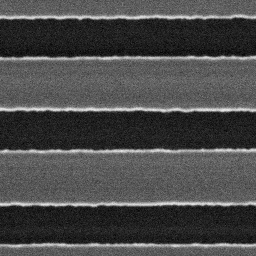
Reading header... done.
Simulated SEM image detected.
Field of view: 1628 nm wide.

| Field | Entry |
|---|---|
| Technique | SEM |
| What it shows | lines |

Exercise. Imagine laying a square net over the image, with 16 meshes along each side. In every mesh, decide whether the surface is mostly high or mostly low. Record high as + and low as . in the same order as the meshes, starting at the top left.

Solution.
++++++++++++++++
................
................
................
++++++++++++++++
++++++++++++++++
++++++++++++++++
................
................
++++++++++++++++
++++++++++++++++
++++++++++++++++
++++++++++++++++
................
................
++++++++++++++++